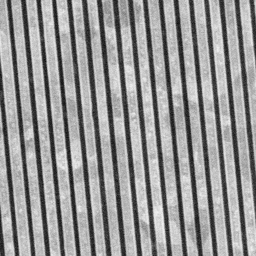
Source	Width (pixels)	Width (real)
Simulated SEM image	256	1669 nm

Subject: parallel lines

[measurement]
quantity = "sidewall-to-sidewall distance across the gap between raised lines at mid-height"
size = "44.6 nm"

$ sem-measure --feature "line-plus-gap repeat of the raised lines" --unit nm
98.9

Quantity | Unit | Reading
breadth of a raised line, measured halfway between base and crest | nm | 55.9